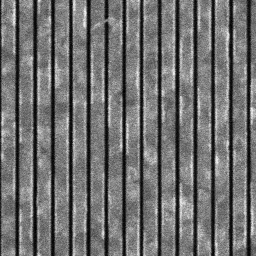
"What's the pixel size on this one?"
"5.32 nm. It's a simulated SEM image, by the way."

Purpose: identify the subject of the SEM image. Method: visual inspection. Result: parallel lines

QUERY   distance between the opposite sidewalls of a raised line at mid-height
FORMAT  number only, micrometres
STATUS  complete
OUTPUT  0.0731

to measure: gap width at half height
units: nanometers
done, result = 23.3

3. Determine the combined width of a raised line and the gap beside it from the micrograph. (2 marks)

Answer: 94.7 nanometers